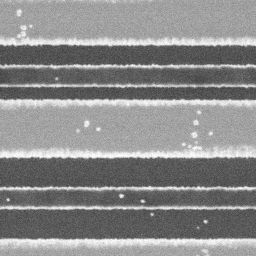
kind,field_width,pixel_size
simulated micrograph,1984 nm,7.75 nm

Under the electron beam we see lines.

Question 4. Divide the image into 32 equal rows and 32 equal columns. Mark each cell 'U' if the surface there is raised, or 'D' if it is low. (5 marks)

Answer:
UUUUUUUUUUUUUUUUUUUUUUUUUUUUUUUU
UUUUUUUUUUUUUUUUUUUUUUUUUUUUUUUU
UUUUUUUUUUUUUUUUUUUUUUUUUUUUUUUU
UUUUUUUUUUUUUUUUUUUUUUUUUUUUUUUU
UUUUUUUUUUUUUUUUUUUUUUUUUUUUUUUU
DDDDDDDDDDDDDDDDDDDDDDDDDDDDDDDD
DDDDDDDDDDDDDDDDDDDDDDDDDDDDDDDD
DDDDDDDDDDDDDDDDDDDDDDDDDDDDDDDD
UUUUUUUUUUUUUUUUUUUUUUUUUUUUUUUU
UUUUUUUUUUUUUUUUUUUUUUUUUUUUUUUU
UUUUUUUUUUUUUUUUUUUUUUUUUUUUUUUU
DDDDDDDDDDDDDDDDDDDDDDDDDDDDDDDD
DDDDDDDDDDDDDDDDDDDDDDDDDDDDDDDD
UUUUUUUUUUUUUUUUUUUUUUUUUUUUUUUU
UUUUUUUUUUUUUUUUUUUUUUUUUUUUUUUU
UUUUUUUUUUUUUUUUUUUUUUUUUUUUUUUU
UUUUUUUUUUUUUUUUUUUUUUUUUUUUUUUU
UUUUUUUUUUUUUUUUUUUUUUUUUUUUUUUU
UUUUUUUUUUUUUUUUUUUUUUUUUUUUUUUU
DDDDDDDDDUUUUUUUUUUUUUDDDDDDDDDD
DDDDDDDDDDDDDDDDDDDDDDDDDDDDDDDD
DDDDDDDDDDDDDDDDDDDDDDDDDDDDDDDD
DDDDDDDDDDDDDDDDDDDDDDDDDDDDDDDD
UUUUDUUUUUUUDUUUUUUUUUUUUUUUUUUU
UUUUUUUUUUUUUUUUUUUUUUUUUUUUUUUU
UUUUUUUUUUUUUUUUUUUUUUUUUUUUUUUU
DDDDDDDDDDDDDDDDDDDDDDDDDDDDDDDD
DDDDDDDDDDDDDDDDDDDDDDDDDDDDDDDD
DDDDDDDDDDDDDDDDDDDDDDDDDDDDDDDD
DDDDDDDDDDDDDDDDDDDDDDDDDDDDDDDD
UUUUUUUUUUUUUUUUUUUUUUUUUUUUUUUU
UUUUUUUUUUUUUUUUUUUUUUUUUUUUUUUU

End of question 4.